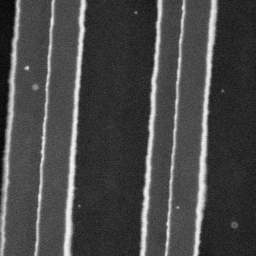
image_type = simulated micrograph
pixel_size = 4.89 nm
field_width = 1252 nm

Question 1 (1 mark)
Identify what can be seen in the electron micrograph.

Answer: lines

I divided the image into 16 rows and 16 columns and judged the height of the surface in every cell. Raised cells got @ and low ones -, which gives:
-@@@@-----@@@---
-@@@@-----@@@---
-@@@@-----@@@---
-@@@@-----@@@---
-@@@@-----@@@---
-@@@@-----@@@---
-@@@@-----@@@---
-@@@@-----@@@---
-@@@@----@@@@---
@@@@@----@@@@---
@@@@-----@@@@---
@@@@-----@@@@---
@@@@-----@@@----
@@@@-----@@@----
@@@@-----@@@----
@@@@-----@@@----